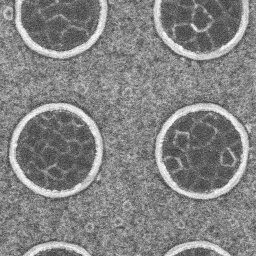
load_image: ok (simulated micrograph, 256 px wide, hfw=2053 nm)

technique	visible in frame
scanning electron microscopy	raised bodies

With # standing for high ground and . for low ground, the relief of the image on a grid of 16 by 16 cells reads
.#####....#####.
.#####....#####.
..####....#####.
............#...
................
................
................
..####.....####.
.#####....#####.
.#####....#####.
.#####....#####.
..###......###..
................
................
................
..###......##...